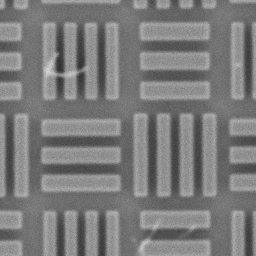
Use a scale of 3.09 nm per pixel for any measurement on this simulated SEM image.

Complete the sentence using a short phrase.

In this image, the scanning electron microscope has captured groups of lines, slits or small figures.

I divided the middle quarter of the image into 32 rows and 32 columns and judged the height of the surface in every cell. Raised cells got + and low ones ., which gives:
+++..+++...++......+++++++++++++
+++.++++...++...................
+++...++...++...................
+++...++...++...................
+++...++...++...................
+++...++...++......+++++++++++++
+++...++...++......+++++++++++++
+++...++...++......+++++++++++++
...........++........+++........
................................
................................
................................
................................
..................+++...++...+++
++++++++++++++....+++...++...+++
++++++++++++++....+++...++...+++
++++++++++++++....+++...++...+++
++++++++++++++....+++...++...+++
..................+++...++...+++
..................+++...++...+++
..................+++...++...+++
++++++++++++++....+++...++...+++
++++++++++++++....+++...++...+++
++++++++++++++....+++...++...+++
++++++++++++++....+++...++...+++
..................+++...++...+++
..................+++...++...+++
..................+++...++...+++
++++++++++++++....+++...++...+++
++++++++++++++....+++...++...+++
++++++++++++++....+++...++...+++
++++++++++++++....+++...++...+++